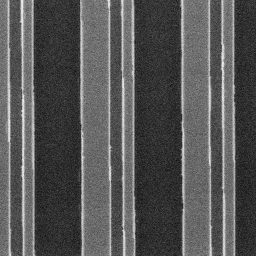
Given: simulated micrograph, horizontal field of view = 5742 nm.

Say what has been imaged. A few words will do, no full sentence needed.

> lines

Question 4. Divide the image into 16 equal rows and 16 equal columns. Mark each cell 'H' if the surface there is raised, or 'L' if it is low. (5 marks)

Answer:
HHLLLHHHLLLHHHHL
HHLLLHHHLLLHHHHL
HHLLLHHHLLLHHHHL
HHLLLHHHLLLHHHHL
HHLLLHHHLLLHHHHL
HHLLLHHHLLLHHHHL
HHLLLHHHLLLHHHHL
HHLLLHHHLLLHHHHL
HHLLLHHHLLLHHHHL
HHLLLHHHLLLHHHHL
HHLLLHHHLLLHHHHL
HHLLLHHHLLLHHHHL
HHLLLHHHLLLHHHHL
HHLLLHHHLLLHHHHL
HHLLLHHHLLLHHHHL
HHLLLHHHLLLHHHHL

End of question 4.